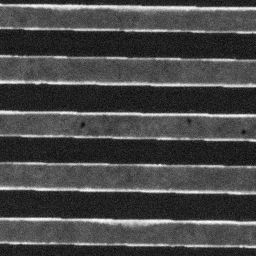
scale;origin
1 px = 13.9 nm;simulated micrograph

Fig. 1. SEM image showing lines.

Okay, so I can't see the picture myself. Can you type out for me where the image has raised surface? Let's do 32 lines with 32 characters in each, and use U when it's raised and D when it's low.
DDDDDDDDDDDDDDDDDDDDDDDDDDDDDDDD
UUUUUUUUUUUUUUUUUUUUUUUUUUUUUUUU
UUUUUUUUUUUUUUUUUUUUUUUUUUUUUUUU
UUUUUUUUUUUUUUUUUUUUUUUUUUUUUUUU
DDDDDDDDDDDDDDDDDDDDDDDDDDDDDDDD
DDDDDDDDDDDDDDDDDDDDDDDDDDDDDDDD
DDDDDDDDDDDDDDDDDDDDDDDDDDDDDDDD
UUUUUUUUUUUUUUUUUUUUUUUUUUUUUDDD
UUUUUUUUUUUUUUUUUUUUUUUUUUUUUUUU
UUUUUUUUUUUUUUUUUUUUUUUUUUUUUUUU
DDDDDDDDDDDDUUUUUUUUUUUUUUUUUUUU
DDDDDDDDDDDDDDDDDDDDDDDDDDDDDDDD
DDDDDDDDDDDDDDDDDDDDDDDDDDDDDDDD
DDDDDDDDDDDDDDDDDDDDDDDDDDDDDDDD
UUUUUUUUUUUUUUUUUUUUUUUUUUUUUUUD
UUUUUUUUUUUUUUUUUUUUUUUUUUUUUUUU
UUUUUUUUUUUUUUUUUUUUUUUUUUUUUUUU
DDDDDDDDDDDDDDDDDDDDDDDDDUUUUUUU
DDDDDDDDDDDDDDDDDDDDDDDDDDDDDDDD
DDDDDDDDDDDDDDDDDDDDDDDDDDDDDDDD
UUUUUUDDDDDDDDDDDDDDDDDDDDDDDDDD
UUUUUUUUUUUUUUUUUUUUUUUUUUUUUUUU
UUUUUUUUUUUUUUUUUUUUUUUUUUUUUUUU
UUUUUUUUUUUUUUUUUUUUUUUUUUUUUUUU
DDDDDDDDDDDDDDDDDDDDDDDDDDDDDDDD
DDDDDDDDDDDDDDDDDDDDDDDDDDDDDDDD
DDDDDDDDDDDDDDDDDDDDDDDDDDDDDDDD
UUUUUUUUUUUUDDDDDDDDDDDDDDDDDDDD
UUUUUUUUUUUUUUUUUUUUUUUUUUUUUUUU
UUUUUUUUUUUUUUUUUUUUUUUUUUUUUUUU
DDDDDDDDDUUUUUUUUUUUUUUUUUUUUUUU
DDDDDDDDDDDDDDDDDDDDDDDDDDDDDDDD